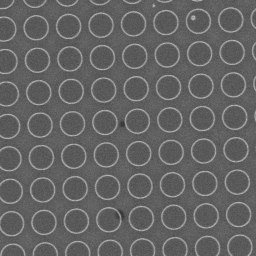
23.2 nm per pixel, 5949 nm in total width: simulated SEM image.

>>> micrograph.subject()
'an array of small figures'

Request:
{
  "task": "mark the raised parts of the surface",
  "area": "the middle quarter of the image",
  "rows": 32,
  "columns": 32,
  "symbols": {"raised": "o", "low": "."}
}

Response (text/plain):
oooo...ooooo....ooo.....ooo.....
ooo.............................
................................
.................ooo....oooo....
oooo....oooo...oooooo..oooooo..o
oooo...oooooo..oooooo..oooooo..o
ooooo..oooooo..oooooo..oooooo..o
ooooo..oooooo..oooooo..oooooo...
oooo....oooo....oooo.....ooo....
ooo.............................
................................
.................ooo.....ooo....
oooo....oooo....ooooo...ooooo...
ooooo..oooooo..oooooo..oooooo...
ooooo..oooooo..oooooo...ooooo...
ooooo..oooooo..oooooo...ooooo...
ooooo...ooooo...oooo.....ooo....
oooo.....ooo....................
................................
..................oo.....ooo....
.ooo....ooooo...ooooo...ooooo...
ooooo...ooooo...oooooo..oooooo..
ooooo...ooooo...oooooo..oooooo..
ooooo...oooooo..oooooo..oooooo..
ooooo...ooooo...ooooo....oooo...
.ooo.....ooo....................
................................
..........................ooo...
.ooo.....oooo....oooo....ooooo..
ooooo...oooooo..oooooo..oooooo..
oooooo..oooooo..oooooo..oooooo..
oooooo..oooooo..oooooo..oooooo..